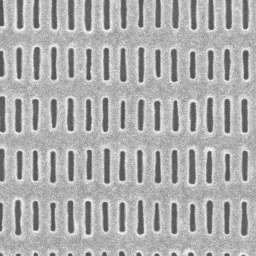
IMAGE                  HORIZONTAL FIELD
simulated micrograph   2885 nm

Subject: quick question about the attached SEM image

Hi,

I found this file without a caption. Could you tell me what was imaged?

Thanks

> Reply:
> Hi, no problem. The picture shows a regular array of holes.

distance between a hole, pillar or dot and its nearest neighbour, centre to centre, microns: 0.191